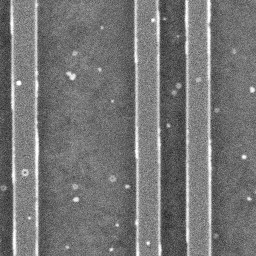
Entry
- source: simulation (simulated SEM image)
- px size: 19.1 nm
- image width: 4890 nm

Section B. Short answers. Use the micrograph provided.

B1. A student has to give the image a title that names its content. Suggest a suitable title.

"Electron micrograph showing lines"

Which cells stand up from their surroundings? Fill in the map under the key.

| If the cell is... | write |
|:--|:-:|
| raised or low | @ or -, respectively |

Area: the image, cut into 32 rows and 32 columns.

-@@@@------------@@@---@@@------
-@@@@------------@@@---@@@------
-@@@@------------@@@---@@@------
-@@@@------------@@@---@@@------
--@@@------------@@@---@@@------
--@@@------------@@@---@@@------
--@@@------------@@@---@@@------
--@@@------------@@@---@@@------
--@@@------------@@@---@@@------
--@@@------------@@@---@@@------
--@@@------------@@@---@@@------
--@@@------------@@@---@@@------
--@@@------------@@@---@@@------
--@@@------------@@@---@@@------
--@@@------------@@@---@@@------
--@@@------------@@@---@@@------
--@@@------------@@@---@@@------
--@@@------------@@@---@@@------
--@@@------------@@@---@@@------
--@@@------------@@@---@@@------
--@@@------------@@@---@@@------
--@@@------------@@@---@@@------
--@@@------------@@@---@@@------
--@@@------------@@@---@@@------
--@@@------------@@@---@@@------
--@@@------------@@@---@@@------
--@@@------------@@@---@@@------
--@@@------------@@@---@@@------
--@@@------------@@@---@@@------
--@@@------------@@@---@@@------
--@@@------------@@@---@@@------
--@@@------------@@@----@@------